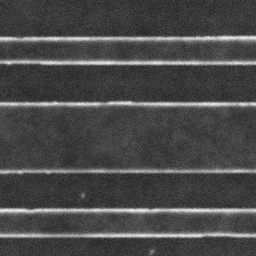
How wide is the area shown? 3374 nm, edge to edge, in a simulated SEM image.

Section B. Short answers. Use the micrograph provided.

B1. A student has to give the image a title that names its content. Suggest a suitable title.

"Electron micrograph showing lines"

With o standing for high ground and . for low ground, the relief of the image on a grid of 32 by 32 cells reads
................................
................................
................................
................................
................................
oooooooooooooooooooooooooooooooo
oooooooooooooooooooooooooooooooo
oooooooooooooooooooooooooooooooo
................................
................................
................................
................................
................................
oooooooooooooooooooooooooooooooo
oooooooooooooooooooooooooooooooo
oooooooooooooooooooooooooooooooo
oooooooooooooooooooooooooooooooo
oooooooooooooooooooooooooooooooo
oooooooooooooooooooooooooooooooo
oooooooooooooooooooooooooooooooo
oooooooooooooooooooooooooooooooo
..o.............................
................................
................................
................................
................................
oooooooooooooooooooooooooooooooo
oooooooooooooooooooooooooooooooo
oooooooooooooooooooooooooooooooo
ooooooooooooooooooooooooo.......
................................
................................